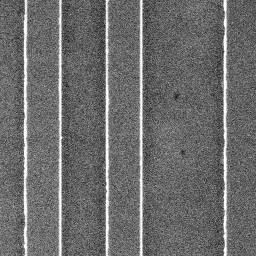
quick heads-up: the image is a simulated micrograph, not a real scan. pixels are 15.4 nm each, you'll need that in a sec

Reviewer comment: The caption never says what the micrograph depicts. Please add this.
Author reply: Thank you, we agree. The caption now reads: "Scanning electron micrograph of lines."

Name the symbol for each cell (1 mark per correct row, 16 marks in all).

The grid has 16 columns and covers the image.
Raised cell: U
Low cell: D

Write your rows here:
DDUUDDDUUDDDDDUU
DDUUDDDUUDDDDDUU
DDUUDDDUUDDDDDUU
DDUUDDDUUDDDDDUU
DDUUDDDUUDDDDDUU
DDUUDDDUUDDDDDUU
DDUUDDDUUDDDDDUU
DDUUDDDUUDDDDDUU
DDUUDDDUUDDDDDUU
DDUUDDDUUDDDDDUU
DDUUDDDUUDDDDDUU
DDUUDDDUUDDDDDUU
DDUUDDDUUDDDDDUU
DDUUDDDUUDDDDDUU
DDUUDDDUUDDDDDUU
DDUUDDDUUDDDDDUU